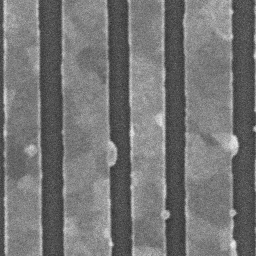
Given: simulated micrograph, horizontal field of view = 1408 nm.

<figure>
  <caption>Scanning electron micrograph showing lines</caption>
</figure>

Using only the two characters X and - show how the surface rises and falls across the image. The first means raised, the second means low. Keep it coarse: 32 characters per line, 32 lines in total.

-XXXX---XXXXX---XXXX---XXXXXX---
-XXXX---XXXXX---XXXX---XXXXXX---
-XXXX---XXXXX---XXXX---XXXXXX---
XXXXX---XXXXX---XXXX---XXXXXX---
-XXXX---XXXXX---XXXX---XXXXXX---
-XXXX---XXXXX---XXXX---XXXXXX---
-XXXX---XXXXX---XXXX---XXXXXX---
-XXXX---XXXXXX--XXXX---XXXXXX---
-XXXX---XXXXXX--XXXXX--XXXXXX---
-XXXX---XXXXXX--XXXXX--XXXXXX---
-XXXX---XXXXXX--XXXXX--XXXXXX---
-XXXX---XXXXXX--XXXXX--XXXXXX---
-XXXX---XXXXXX--XXXXX--XXXXXX---
-XXXX---XXXXXX--XXXXX--XXXXXX---
-XXXX---XXXXXX--XXXXX--XXXXXX---
-XXXX---XXXXXX--XXXXX--XXXXXX---
-XXXX---XXXXXX--XXXXX--XXXXXX---
-XXXX---XXXXXX--XXXXX--XXXXXX---
-XXXX---XXXXXX--XXXXX--XXXXXX---
-XXXX---XXXXXX--XXXXX--XXXXXX---
-XXXX---XXXXXX--XXXXX--XXXXXX---
-XXXX---XXXXXX--XXXXX--XXXXXX---
-XXXX---XXXXXX---XXXX--XXXXXX---
-XXXX---XXXXXX--XXXXX--XXXXXX---
-XXXX---XXXXXX---XXXX--XXXXXX---
-XXXX---XXXXXX---XXXX--XXXXXX---
-XXXX---XXXXXX---XXXX--XXXXXX---
-XXXX---XXXXXX---XXXX--XXXXXX---
-XXXX---XXXXXX---XXXX--XXXXXX---
-XXXX---XXXXXX---XXXX--XXXXXX---
-XXXX---XXXXXX---XXXX--XXXXXX---
-XXXX---XXXXXX---XXXX--XXXXXX---